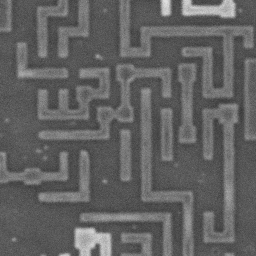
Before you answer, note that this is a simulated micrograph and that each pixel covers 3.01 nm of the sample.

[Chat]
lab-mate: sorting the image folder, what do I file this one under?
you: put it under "wiring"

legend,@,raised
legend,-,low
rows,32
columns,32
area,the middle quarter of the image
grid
-------------@@@@------------@@@
@---@@@@@@@--@@@@@@@@@@@@@@--@@@
@---@@@@@@@--@@@@@@@@@@@@@@--@@@
---------@@--@@@@@------@@@--@@@
---------@@---@@@--------@@--@@@
---------@@---@@---------@@---@@
@--@@@@@@@@---@@---@@----@@---@@
@--@@@@@@@@---@@---@@----@@---@@
@--@@@@@-@----@@---@@---------@@
@---@@--------@@---@@@--------@@
@---@@--------@@@--@@@--------@@
@@-@@@--@@@@@@@@@--@@---@@@---@@
@@@@@@--@@@@@@@@@--@@---@@@---@@
@@@@@@--@@@@@@@@@--@@@--@@@---@@
---------@@--------@@@---@@---@@
---------@@--------@@@---@@--@@@
---------@@--------@@@---@@--@@@
@@@@@@@@@@@---@@@--@@@--@@@--@@@
@@@@@@@@@@@---@@---@@@---@@--@@@
--------------@@---@@@---@@--@@@
--------------@@@--@@@---@@-----
--------------@@@--@@@---@@-----
@---@@--------@@@--@@@---@@-----
@---@@--------@@@--@@@---@@-----
@---@@--------@@@--@@@----------
@---@@--------@@@--@@@----------
@---@@--------@@@--@@@----------
@---@@--------@@@--@@@----------
@---@@--------@@@---@@----------
----@@----@---------@@----------
----@@--------------@@----------
----@@--------------@@----------